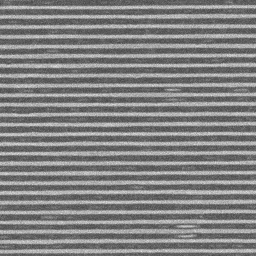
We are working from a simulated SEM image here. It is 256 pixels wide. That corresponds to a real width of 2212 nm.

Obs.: parallel lines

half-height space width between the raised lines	57.2	nm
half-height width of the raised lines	29.2	nm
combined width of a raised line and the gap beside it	9.75	pixels